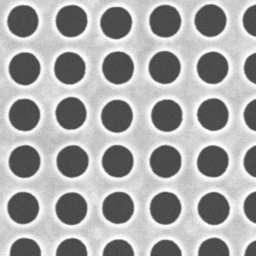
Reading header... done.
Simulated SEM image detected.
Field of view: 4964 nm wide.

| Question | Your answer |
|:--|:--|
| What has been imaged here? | a regular array of holes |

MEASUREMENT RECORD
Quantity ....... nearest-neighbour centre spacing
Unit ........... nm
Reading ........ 889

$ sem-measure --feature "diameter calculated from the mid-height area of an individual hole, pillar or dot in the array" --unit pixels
33.4